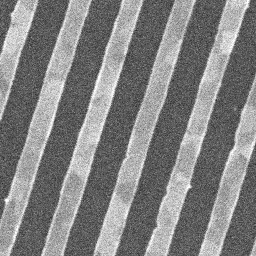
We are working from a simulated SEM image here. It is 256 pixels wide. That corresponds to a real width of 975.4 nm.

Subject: parallel lines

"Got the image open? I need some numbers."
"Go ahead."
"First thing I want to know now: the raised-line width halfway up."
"73.1 nm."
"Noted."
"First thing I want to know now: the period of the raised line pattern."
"49.8 pixels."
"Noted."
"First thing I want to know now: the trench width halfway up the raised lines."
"117 nanometers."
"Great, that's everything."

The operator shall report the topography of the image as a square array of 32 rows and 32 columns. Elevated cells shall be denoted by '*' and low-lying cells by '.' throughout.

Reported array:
..***....**....***....**....***.
..**....***....**....***....**..
.***....***....**....***....**..
.***....**....***....**....***..
.**....***....**....***....***..
.**....***....**....***....**...
***....**....***....**....***...
**....***....**....***....**....
**....***....**....***....**....
**....**....***....**....***....
*....***....**.....**....**.....
*....***....**....***....**....*
*....**....***....***....**....*
*....**....***....**....***....*
....***....**....***....**....**
....**....***....**.....**....**
....**....***....**....***....**
...***....**....***....**....***
...***....**....**.....**....***
...**....***....**....***....**.
..***....**....***....**....***.
..***....**....***....**....***.
..**....***....**....***....**..
.***....***...***....**....***..
.***....**....***....**....***..
.**....***....**....***....**...
***....***...***....**.....**...
***....**....***....**....***...
**....***....**.....**....**....
**....***...***....**.....**....
**....**....***....**....***....
*....***....**....***....**.....